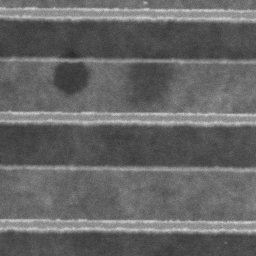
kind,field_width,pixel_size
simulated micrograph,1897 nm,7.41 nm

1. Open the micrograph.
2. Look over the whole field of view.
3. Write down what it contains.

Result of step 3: lines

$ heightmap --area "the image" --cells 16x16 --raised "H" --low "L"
HHHHHHHHHHHHHHHH
LLLLLLLLLLLLLLLL
LLLLLLLLLLLLLLLL
LLLLLLLLLLLLLLLL
HHHHHHHHHHHHHHHH
HHHHHHHHHHHHHHHH
HHHHHHHHHHHHHHHH
HHHHHHHHHHHHHHHH
LLLLLLLLLLLLLLLL
LLLLLLLLLLLLLLLL
LLLLLLLLLLLLLLLL
HHHHHHHHHHHHHHHH
HHHHHHHHHHHHHHHH
HHHHHHHHHHHHHHHH
LLLLLLLLLLLLLLLL
LLLLLLLLLLLLLLLL